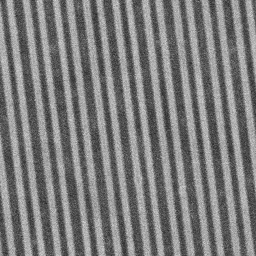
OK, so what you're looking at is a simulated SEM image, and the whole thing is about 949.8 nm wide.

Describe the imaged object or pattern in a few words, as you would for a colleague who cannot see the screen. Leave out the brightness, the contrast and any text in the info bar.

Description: parallel lines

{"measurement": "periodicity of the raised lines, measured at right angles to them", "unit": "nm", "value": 54.8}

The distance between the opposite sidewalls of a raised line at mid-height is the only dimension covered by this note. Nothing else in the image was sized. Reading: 0.0179 um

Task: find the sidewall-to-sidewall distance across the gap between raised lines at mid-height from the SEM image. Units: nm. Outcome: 32.6